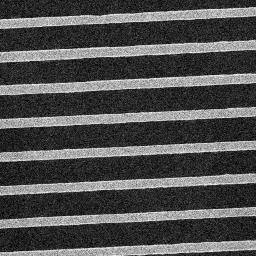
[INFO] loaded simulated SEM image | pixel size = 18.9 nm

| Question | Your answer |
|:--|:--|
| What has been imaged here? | parallel lines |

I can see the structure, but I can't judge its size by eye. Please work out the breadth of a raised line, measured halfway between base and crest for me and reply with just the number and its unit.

165 nanometres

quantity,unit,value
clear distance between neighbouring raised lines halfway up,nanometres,465